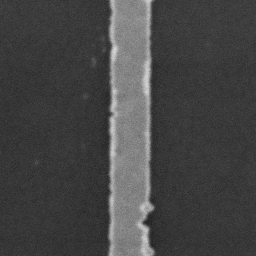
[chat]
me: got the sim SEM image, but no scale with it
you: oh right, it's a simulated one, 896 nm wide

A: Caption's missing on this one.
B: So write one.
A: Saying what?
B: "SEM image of one or a few lines or trenches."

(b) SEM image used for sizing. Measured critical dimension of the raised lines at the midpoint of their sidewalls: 131 nanometres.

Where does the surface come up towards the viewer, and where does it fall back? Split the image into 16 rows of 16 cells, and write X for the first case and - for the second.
-------XX-------
-------XX-------
-------XX-------
-------XX-------
-------XX-------
-------XX-------
-------XX-------
-------XX-------
-------XX-------
-------XX-------
-------XX-------
-------XX-------
-------XX-------
-------XX-------
-------XX-------
-------XX-------